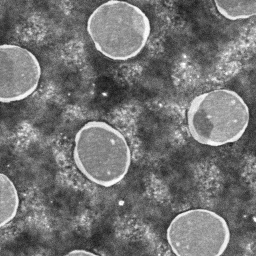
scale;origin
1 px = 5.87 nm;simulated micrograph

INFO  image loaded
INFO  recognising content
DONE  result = raised bodies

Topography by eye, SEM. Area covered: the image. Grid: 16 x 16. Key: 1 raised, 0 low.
0000001100000011
0000001110000000
0000001110000000
1100000100000000
1100000000000000
1100000000000000
0000000000001110
0000000000001110
0000011000001110
0000011100000000
0000011100000000
1000000000000000
1000000000000000
1000000000011100
0000000000011100
0000000000011100